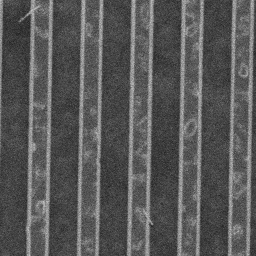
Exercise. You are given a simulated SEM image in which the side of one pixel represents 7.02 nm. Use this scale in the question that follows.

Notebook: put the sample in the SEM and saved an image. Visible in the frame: parallel lines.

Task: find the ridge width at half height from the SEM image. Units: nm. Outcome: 133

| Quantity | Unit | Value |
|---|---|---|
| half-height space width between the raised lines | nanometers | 219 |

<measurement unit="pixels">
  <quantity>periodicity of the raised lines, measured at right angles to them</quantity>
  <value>50.3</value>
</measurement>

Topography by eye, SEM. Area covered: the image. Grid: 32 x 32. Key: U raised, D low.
DDDDUUDDDDUUUDDDDUUDDDDUUDDDDUUU
DDDDUUDDDDUUUDDDDUUDDDDUUDDDDUUU
DDDDUUDDDDUUUDDDDUUDDDDUUDDDDUUD
DDDDUUDDDDUUUDDDDUUDDDDUUDDDDUUD
DDDDUUDDDDUUUDDDDUUDDDDUUDDDDUUD
DDDDUUDDDDUUUDDDDUUDDDDUUDDDDUUD
DDDDUUDDDDUUUDDDDUUDDDDUUDDDDUUD
DDDDUUDDDDUUUDDDDUUDDDDUUDDDDUUD
DDDDUUDDDDUUUDDDDUUDDDDUUDDDDUUD
DDDDUUDDDDUUUDDDDUUDDDDUUDDDDUUD
DDDDUUDDDDUUDDDDUUUDDDDUUDDDDUUD
DDDDUUDDDDUUDDDDUUUDDDDUUDDDDUUD
DDDDUUDDDDUUDDDDUUUDDDDUUDDDDUUD
DDDDUUDDDDUUDDDDUUUDDDDUUDDDDUUD
DDDDUUDDDDUUDDDDUUUDDDDUUDDDDUUD
DDDDUUDDDDUUDDDDUUUDDDDUUDDDDUUD
DDDDUUDDDDUUDDDDUUUDDDDUUDDDDUUD
DDDDUUDDDDUUDDDDUUUDDDDUUDDDDUUD
DDDDUUDDDDUUDDDDUUUDDDDUUDDDDUUD
DDDDUUDDDDUUDDDDUUUDDDDUUDDDDUUD
DDDDUUDDDDUUDDDDUUUDDDDUUDDDDUUD
DDDDUUDDDDUUDDDDUUUDDDDUUDDDDUUD
DDDDUUDDDDUUDDDDUUUDDDDUUDDDDUUD
DDDDUUDDDDUUDDDDUUUDDDDUUDDDDUUD
DDDDUUDDDDUUDDDDUUDDDDDUUDDDDUUD
DDDDUUDDDDUUDDDDUUDDDDDUUDDDDUUD
DDDDUUDDDDUUDDDDUUDDDDDUUDDDDUUD
DDDDUUDDDDUUDDDDUUUDDDDUUDDDDUUD
DDDUUUDDDDUUDDDDUUDDDDDUUDDDDUUD
DDDDUUDDDDUUDDDDUUDDDDDUUDDDDUUD
DDDDUUDDDDUUDDDDUUDDDDUUUDDDDUUD
DDDDUUDDDDUUDDDDUUDDDDUUUDDDDUUD